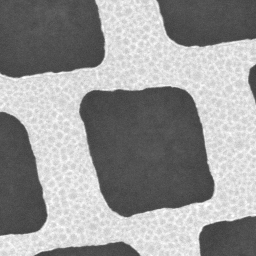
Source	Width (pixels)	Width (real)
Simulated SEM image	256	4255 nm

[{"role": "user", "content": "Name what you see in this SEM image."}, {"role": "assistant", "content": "holes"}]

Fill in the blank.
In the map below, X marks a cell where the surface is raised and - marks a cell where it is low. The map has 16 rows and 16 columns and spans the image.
------XXXX------
------XXXX------
-------XXXX-----
-------XXXXXXXXX
----XXXXXXXXXXXX
XXXXXXXXX--XXXXX
XXXXX-------XXXX
-XXXX--------XXX
--XXX--------XXX
--XXXX-------XXX
--XXXX-------XXX
---XXX-------XXX
---XXXX------XXX
---XXXX-XXXXXXXX
--XXXXXXXXXXX---
XXXX----XXXX----